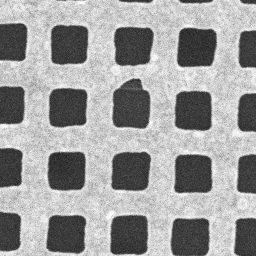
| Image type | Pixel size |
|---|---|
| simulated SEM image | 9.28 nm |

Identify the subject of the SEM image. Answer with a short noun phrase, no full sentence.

a regular array of holes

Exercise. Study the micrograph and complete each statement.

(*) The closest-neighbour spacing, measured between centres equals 584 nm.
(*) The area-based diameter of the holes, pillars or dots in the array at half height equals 396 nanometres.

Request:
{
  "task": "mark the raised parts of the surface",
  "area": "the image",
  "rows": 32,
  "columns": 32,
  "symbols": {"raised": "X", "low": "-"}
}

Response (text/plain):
XXXXXXXXXXXXXXXXXXXXXXXXXXXXXXX-
XXXXXXXXXXXXXXXXXXXXXXXXXXXXXXXX
XXXXXXXXXXXXXXXXXXXXXXXXXXXXXXXX
---XXXX----XXXX----XXXX-XXXXXXXX
---XXX-----XXX-----XXX-----XXX--
---XXX-----XXX-----XXX-----XXX--
---XXX-----XXX-----XXX-----XXX--
---XXX-----XXX-----XXX-----XXX--
XXXXXXXXXXXXXXXXXXXXXXXXXXXXXX--
XXXXXXXXXXXXXXXXXXXXXXXXXXXXXXXX
XXXXXXXXXXXXXXX---XXXXXXXXXXXXXX
---XXX-----XXX----XXXXX---XXXXXX
---XXX-----XXX-----XXX----XXXX--
---XXX-----XXX-----XXX-----XXX--
---XXX-----XXX-----XXX-----XXX--
--XXXX-----XXX-----XXX----XXXX--
XXXXXXXXXXXXXXXXXXXXXXXXXXXXXXXX
XXXXXXXXXXXXXXXXXXXXXXXXXXXXXXXX
XXXXXXXXXXXXXXXXXXXXXXXXXXXXXXXX
---XXX-----XXX-----XXX----XXXX--
---XXX-----XXX-----XXX----XXXX--
---XXX-----XXX-----XXX-----XXX--
---XXX-----XXX-----XXX-----XXX--
XXXXXX----XXXX----XXXX-----XXX--
XXXXXXXXXXXXXXXXXXXXXXXXXXXXXXXX
XXXXXXXXXXXXXXXXXXXXXXXXXXXXXXXX
--XXXXXXXXXXXXXXXXXXXXXXXXXXXXXX
---XXX-----XXX----XXXX----XXXX--
---XXX-----XXX-----XX-----XXX---
---XXX-----XXX-----XX-----XXX---
---XXX-----XXX-----XX-----XXX---
XXXXXXX---XXXX----XXX-----XXX---